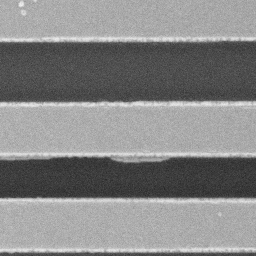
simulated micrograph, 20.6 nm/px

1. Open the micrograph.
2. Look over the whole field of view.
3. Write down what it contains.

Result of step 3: lines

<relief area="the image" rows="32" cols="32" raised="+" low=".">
++++++++++++++++++++++++++++++++
++++++++++++++++++++++++++++++++
++++++++++++++++++++++++++++++++
++++++++++++++++++++++++++++++++
++++++++++++++++++++++++++++++++
................................
................................
................................
................................
................................
................................
................................
................................
++++++++++++++++++++++++++++++++
++++++++++++++++++++++++++++++++
++++++++++++++++++++++++++++++++
++++++++++++++++++++++++++++++++
++++++++++++++++++++++++++++++++
++++++++++++++++++++++++++++++++
................................
................................
................................
................................
................................
................................
++++++++++++++++++++++++++++++++
++++++++++++++++++++++++++++++++
++++++++++++++++++++++++++++++++
++++++++++++++++++++++++++++++++
++++++++++++++++++++++++++++++++
++++++++++++++++++++++++++++++++
................................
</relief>